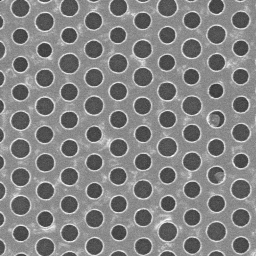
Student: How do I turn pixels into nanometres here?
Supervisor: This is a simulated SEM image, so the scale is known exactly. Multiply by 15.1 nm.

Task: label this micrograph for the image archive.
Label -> a regular array of holes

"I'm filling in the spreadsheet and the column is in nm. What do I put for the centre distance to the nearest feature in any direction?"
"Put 421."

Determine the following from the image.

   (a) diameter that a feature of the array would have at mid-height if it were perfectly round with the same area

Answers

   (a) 17.4 pixels